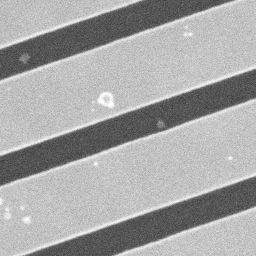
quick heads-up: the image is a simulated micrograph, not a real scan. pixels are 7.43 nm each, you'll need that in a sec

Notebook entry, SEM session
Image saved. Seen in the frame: lines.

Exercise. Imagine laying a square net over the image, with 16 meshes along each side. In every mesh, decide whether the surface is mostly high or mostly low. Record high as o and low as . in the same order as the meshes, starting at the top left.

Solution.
ooooooo......ooo
oooo......oooooo
oo.....ooooooooo
.....ooooooooooo
..ooooooooooooo.
oooooooooooo....
ooooooooo......o
oooooo......oooo
oooo.....ooooooo
o.....oooooooooo
....oooooooooooo
.ooooooooooooo..
oooooooooooo....
ooooooooo.....oo
oooooo.....ooooo
ooo......ooooooo